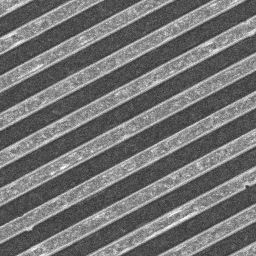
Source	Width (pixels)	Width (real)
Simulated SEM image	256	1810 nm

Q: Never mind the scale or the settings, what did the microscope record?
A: parallel lines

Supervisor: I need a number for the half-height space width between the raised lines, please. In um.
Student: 0.13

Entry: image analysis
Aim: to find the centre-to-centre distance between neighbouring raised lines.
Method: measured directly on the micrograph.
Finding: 236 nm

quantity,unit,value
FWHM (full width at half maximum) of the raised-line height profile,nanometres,105